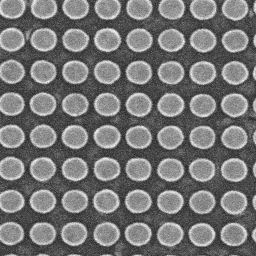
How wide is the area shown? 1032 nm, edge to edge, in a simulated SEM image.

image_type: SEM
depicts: a regular array of raised bodies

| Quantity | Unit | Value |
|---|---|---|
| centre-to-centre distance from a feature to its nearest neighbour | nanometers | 128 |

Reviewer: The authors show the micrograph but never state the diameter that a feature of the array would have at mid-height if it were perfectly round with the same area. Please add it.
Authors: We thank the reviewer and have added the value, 95.2 nanometres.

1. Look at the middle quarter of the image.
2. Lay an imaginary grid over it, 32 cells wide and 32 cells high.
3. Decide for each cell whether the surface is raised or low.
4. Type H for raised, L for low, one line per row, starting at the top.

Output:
HHHHHLLLHHHHHLLLHHHHHLLLHHHHHLLL
HHHHHHLLHHHHHHLLHHHHHHLLHHHHHHLL
HHHHHHLLHHHHHHLLHHHHHHLLHHHHHHLL
HHHHHLLLHHHHHLLLHHHHHLLLHHHHHLLL
LHHHLLLLLHHHLLLLLHHHLLLLLHHHLLLL
LLLLLLLLLLLLLLLLLLLLLLLLLLLLLLLL
LLLLLLLLLLLLLLLLLLLLLLLLLLLLLLLL
LLLLLLLLLHHHLLLLLLLLLLLLLLLLLLLL
HHHHHLLLHHHHHLLLHHHHHLLLHHHHHLLL
HHHHHHLLHHHHHHLLHHHHHHLLHHHHHHLL
HHHHHHLLHHHHHHLLHHHHHHLHHHHHHHLL
HHHHHHLLHHHHHHLLHHHHHLLLHHHHHLLL
LHHHLLLLLHHHHLLLLHHHHLLLLHHHLLLL
LLLLLLLLLLLLLLLLLLLLLLLLLLLLLLLL
LLLLLLLLLLLLLLLLLLLLLLLLLLLLLLLL
LLHLLLLLLLLLLLLLLLLLLLLLLLLLLLLL
HHHHHLLLHHHHHLLLHHHHHLLLHHHHHLLL
HHHHHHLLHHHHHHLLHHHHHLLLHHHHHLLL
HHHHHHLLHHHHHHLLHHHHHHLLHHHHHHLL
HHHHHLLLHHHHHLLLHHHHHLLLHHHHHLLL
LHHHHLLLLHHHHLLLLHHHHLLLLHHHLLLL
LLLLLLLLLLLLLLLLLLLLLLLLLLLLLLLL
LLLLLLLLLLLLLLLLLLLLLLLLLLLLLLLL
LLLLLLLLLLLLLLLLLLLLLLLLLLLLLLLL
HHHHHLLLHHHHHLLLHHHHHLLLLHHHHLLL
HHHHHHLLHHHHHHLLHHHHHLLLHHHHHHLL
HHHHHHLLHHHHHHLLHHHHHHLLHHHHHHLH
HHHHHHLLHHHHHLLLHHHHHLLLHHHHHHLL
LHHHHLLLLHHHLLLLLHHHHLLLLHHHHLLL
LLLLLLLLLLLLLLLLLLLLLLLLLLLLLLLL
LLLLLLLLLLLLLLLLLLLLLLLLLLLLLLLL
LLLLLLLLLLLLLLLLLLLLLLLLLLLLLLLL